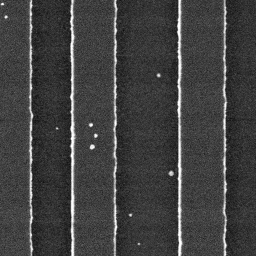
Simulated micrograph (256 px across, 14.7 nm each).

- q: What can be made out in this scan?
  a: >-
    lines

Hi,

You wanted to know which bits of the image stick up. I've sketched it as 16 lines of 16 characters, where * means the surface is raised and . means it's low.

**...**....***..
**..***....***..
**...**....***..
**..***....***..
**...**....***..
**...**....***..
**...**....***..
**...**....***..
**...**....***..
**...**....***..
**...**....***..
**...**....***..
**...**....***..
**...**....***..
**...**....***..
**...**....***..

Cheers